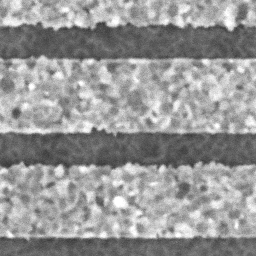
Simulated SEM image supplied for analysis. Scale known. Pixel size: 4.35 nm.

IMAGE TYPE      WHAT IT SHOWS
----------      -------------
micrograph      one or a few lines or trenches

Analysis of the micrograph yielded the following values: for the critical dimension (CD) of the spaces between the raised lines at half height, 155 nm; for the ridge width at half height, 305 nanometres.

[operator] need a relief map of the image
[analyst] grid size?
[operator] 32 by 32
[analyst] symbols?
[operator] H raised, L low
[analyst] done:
HHHHHHHHHHHHHHHHHHHHHHHHHHHHHHHH
HHHHHHHHHHHHHHHHHHHHHHHHHHHHHHHH
HHHHHHHHHHHHHHHHHHHHHHHHHHHHHHHH
LLLLLLLLLLLLLLLLLLLLLLLLLLLLLLLL
LLLLLLLLLLLLLLLLLLLLLLLLLLLLLLLL
LLLLLLLLLLLLLLLLLLLLLLLLLLLLLLLL
LLLLLLLLLLLLLLLLLLLLLLLLLLLLLLLL
LLLHHHLLLLLLLLLLLLLLLLLLLLLLLLLL
HHHHHHHHHHHHHHHHHHHHHHHHHHHHHHHH
HHHHHHHHHHHHHHHHHHHHHHHHHHHHHHHH
HHHHHHHHHHHHHHHHHHHHHHHHHHHHHHHH
HHHHHHHHHHHHHHHHHHHHHHHHHHHHHHHH
HHHHHHHHHHHHHHHHHHHHHHHHHHHHHHHH
HHHHHHHHHHHHHHHHHHHHHHHHHHHHHHHH
HHHHHHHHHHHHHHHHHHHHHHHHHHHHHHHH
HHHHHHHHHHHHHHHHHHHHHHHHHHHHHHHH
LLLLLHLLLLLLLLLLLLLLLLLLLLLLLHLH
LLLLLLLLLLLLLLLLLLLLLLLLLLLLLLLL
LLLLLLLLLLLLLLLLLLLLLLLLLLLLLLLL
LLLLLLLLLLLLLLLLLLLLLLLLLLLLLLLL
LLLLLLLLLLLLLLLLLLLLLLLLLLLLLLLL
HHHHHHHHHHHHHHHHHHHHHHHHHHHHHHHH
HHHHHHHHHHHHHHHHHHHHHHHHHHHHHHHH
HHHHHHHHHHHHHHHHHHHHHHHHHHHHHHHH
HHHHHHHHHHHHHHHHHHHHHHHHHHHHHHHH
HHHHHHHHHHHHHHHHHHHHHHHHHHHHHHHH
HHHHHHHHHHHHHHHHHHHHHHHHHHHHHHHH
HHHHHHHHHHHHHHHHHHHHHHHHHHHHHHHH
HHHHHHHHHHHHHHHHHHHHHHHHHHHHHHHH
LHLHLLLLHLHLLHLHHHHLHHHHLHHHHHHH
LLLLLLLLLLLLLLLLLLLLLLLLLLLLLLLL
LLLLLLLLLLLLLLLLLLLLLLLLLLLLLLLL